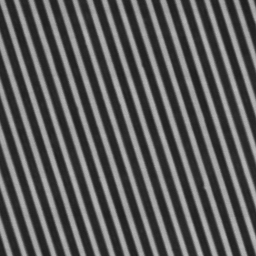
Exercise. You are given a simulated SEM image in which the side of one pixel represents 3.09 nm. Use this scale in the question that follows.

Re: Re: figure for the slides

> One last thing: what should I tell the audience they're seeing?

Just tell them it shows parallel lines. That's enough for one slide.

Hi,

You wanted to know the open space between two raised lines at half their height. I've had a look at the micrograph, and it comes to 24 nanometres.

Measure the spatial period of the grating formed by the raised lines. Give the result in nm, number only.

43.2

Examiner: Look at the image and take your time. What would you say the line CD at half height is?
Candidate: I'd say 20.6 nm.